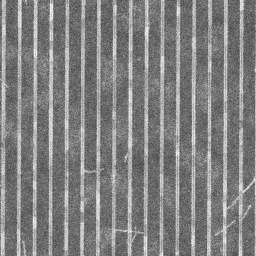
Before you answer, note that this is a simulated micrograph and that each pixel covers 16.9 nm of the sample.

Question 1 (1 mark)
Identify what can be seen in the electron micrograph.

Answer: parallel lines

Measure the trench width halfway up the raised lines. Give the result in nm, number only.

228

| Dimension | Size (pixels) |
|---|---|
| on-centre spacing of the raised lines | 15.9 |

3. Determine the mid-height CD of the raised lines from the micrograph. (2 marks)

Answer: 0.038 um